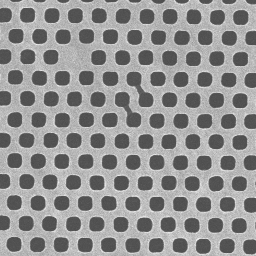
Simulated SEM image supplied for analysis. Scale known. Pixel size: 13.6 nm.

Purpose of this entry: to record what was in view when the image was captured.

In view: a regular array of holes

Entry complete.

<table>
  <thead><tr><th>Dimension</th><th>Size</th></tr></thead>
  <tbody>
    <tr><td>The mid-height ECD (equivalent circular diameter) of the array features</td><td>212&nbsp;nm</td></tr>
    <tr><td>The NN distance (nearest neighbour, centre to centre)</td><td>318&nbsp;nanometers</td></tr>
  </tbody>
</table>